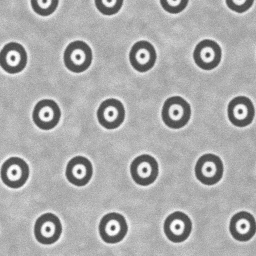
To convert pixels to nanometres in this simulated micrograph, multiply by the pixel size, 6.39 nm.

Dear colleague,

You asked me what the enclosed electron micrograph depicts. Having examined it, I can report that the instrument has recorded a regular array of ring-shaped grooves with a dot in the middle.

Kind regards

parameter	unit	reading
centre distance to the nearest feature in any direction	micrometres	0.415